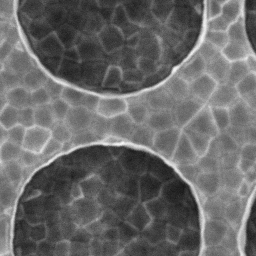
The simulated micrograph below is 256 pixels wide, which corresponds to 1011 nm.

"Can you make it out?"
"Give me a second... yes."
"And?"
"holes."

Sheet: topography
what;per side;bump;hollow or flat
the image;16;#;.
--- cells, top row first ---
#............##.
#............##.
##..........####
##..........####
###........#####
#####....#######
################
################
################
####.....#######
###........#####
##..........####
#...........####
#............###
#............##.
#............##.